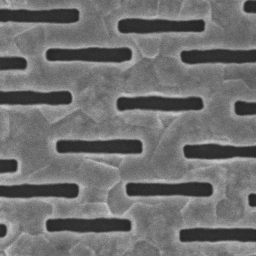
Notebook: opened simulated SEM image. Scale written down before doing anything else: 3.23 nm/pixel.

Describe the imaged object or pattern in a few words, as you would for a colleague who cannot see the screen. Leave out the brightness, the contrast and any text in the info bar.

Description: holes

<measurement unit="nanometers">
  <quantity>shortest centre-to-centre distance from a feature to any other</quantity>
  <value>246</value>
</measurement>